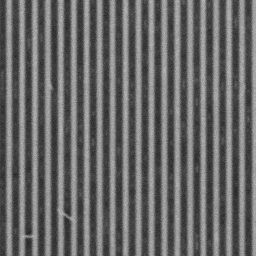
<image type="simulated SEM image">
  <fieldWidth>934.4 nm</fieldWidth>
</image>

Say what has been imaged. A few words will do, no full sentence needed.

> parallel lines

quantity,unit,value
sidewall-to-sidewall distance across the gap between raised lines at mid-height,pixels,7.12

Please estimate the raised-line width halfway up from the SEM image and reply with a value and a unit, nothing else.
19.6 nanometers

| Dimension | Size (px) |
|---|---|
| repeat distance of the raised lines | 12.9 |